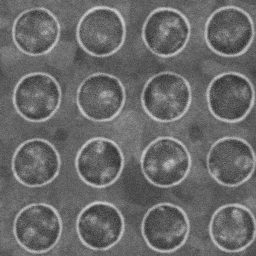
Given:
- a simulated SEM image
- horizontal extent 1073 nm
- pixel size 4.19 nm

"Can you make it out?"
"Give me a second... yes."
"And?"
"a regular array of holes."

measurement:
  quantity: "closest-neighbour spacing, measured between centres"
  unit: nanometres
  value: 268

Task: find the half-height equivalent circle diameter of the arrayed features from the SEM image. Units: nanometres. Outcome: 195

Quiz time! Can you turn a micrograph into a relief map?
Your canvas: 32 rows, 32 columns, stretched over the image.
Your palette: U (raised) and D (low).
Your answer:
UUUUUUUUUUUUUUUUUUUUUUUUUUUUUUUU
UUUDDDUUUUUDDDUUUUUDDDUUUUUDDDUU
UUDDDDDUUUDDDDDUUUDDDDDUUUDDDDDU
UUDDDDDUUUDDDDDUUUDDDDDDUUDDDDDD
UUDDDDDUUUDDDDDUUUDDDDDDUUDDDDDD
UUDDDDDUUUDDDDDUUUDDDDDUUUDDDDDU
UUUDDDUUUUUDDDUUUUUDDDUUUUUDDDUU
UUUUUUUUUUUUUUUUUUUUUUUUUUUUUUUU
UUUUUUUUUUUUUUUUUUUUUUUUUUUUUUUU
UUUDDDUUUUUUDDUUUUUUDDUUUUUDDDUU
UUDDDDDUUUDDDDDUUUDDDDDUUUDDDDDU
UUDDDDDUUUDDDDDDUUDDDDDDUUDDDDDD
UUDDDDDUUUDDDDDDUUDDDDDDUUDDDDDD
UUDDDDDUUUDDDDDUUUDDDDDUUUDDDDDU
UUUDDDUUUUUDDDUUUUUDDDDUUUUDDDDU
UUUUUUUUUUUUUUUUUUUUUUUUUUUUUUUU
UUUUUUUUUUUUUUUUUUUUUUUUUUUUUUUU
UUUUDUUUUUUUDUUUUUUUDDUUUUUUDDUU
UUDDDDDUUUDDDDDUUUDDDDDUUUDDDDDU
UUDDDDDUUUDDDDDUUUDDDDDDUUDDDDDD
UUDDDDDUUUDDDDDUUUDDDDDDUUDDDDDD
UUDDDDDUUUDDDDDUUUDDDDDUUUDDDDDU
UUDDDDUUUUDDDDUUUUUDDDDUUUUDDDDU
UUUUUUUUUUUUUUUUUUUUUUUUUUUUUUUU
UUUUUUUUUUUUUUUUUUUUUUUUUUUUUUUU
UUUUUUUUUUUUDUUUUUUUUUUUUUUUUUUU
UUUDDDDUUUDDDDDUUUUDDDDUUUUDDDDU
UUDDDDDUUUDDDDDUUUDDDDDUUUUDDDDD
UUDDDDDDUUDDDDDUUUDDDDDUUUDDDDDD
UUDDDDDUUUDDDDDUUUDDDDDUUUUDDDDD
UUUDDDDUUUUDDDUUUUUDDDDUUUUDDDDU
UUUUDUUUUUUUUUUUUUUUUUUUUUUUUUUU